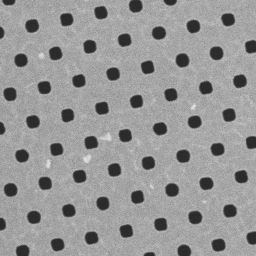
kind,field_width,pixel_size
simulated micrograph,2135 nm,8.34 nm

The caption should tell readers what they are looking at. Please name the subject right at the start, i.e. a regular array of holes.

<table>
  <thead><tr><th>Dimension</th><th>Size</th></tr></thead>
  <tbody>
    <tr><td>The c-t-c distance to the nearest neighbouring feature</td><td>35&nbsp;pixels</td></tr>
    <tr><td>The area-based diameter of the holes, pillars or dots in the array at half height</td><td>0.115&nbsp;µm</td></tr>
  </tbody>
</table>